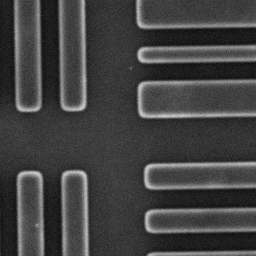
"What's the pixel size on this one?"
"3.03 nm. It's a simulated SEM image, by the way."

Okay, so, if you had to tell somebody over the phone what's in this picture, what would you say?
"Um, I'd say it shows groups of lines, slits or small figures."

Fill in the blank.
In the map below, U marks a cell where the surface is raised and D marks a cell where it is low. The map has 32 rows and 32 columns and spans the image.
DDUUUDDDUUUDDDDDDUUUUUUUUUUUUUUU
DDUUUDDDUUUDDDDDDUUUUUUUUUUUUUUU
DDUUUDDDUUUDDDDDDUUUUUUUUUUUUUUU
DDUUUDDDUUUDDDDDDDDDDDDDDDDDDDDD
DDUUUDDDUUUDDDDDDDDDDDDDDDDDDDDD
DDUUUDDDUUUDDDDDDDDDDDDDDDDDDDDD
DDUUUDDDUUUDDDDDDDUUUUUUUUUUUUUU
DDUUUDDDUUUDDDDDDDUUUUUUUUUUUUUU
DDUUUDDDUUUDDDDDDDDDDDDDDDDDDDDD
DDUUUDDDUUUDDDDDDDDDDDDDDDDDDDDD
DDUUUDDDUUUDDDDDDDUUUUUUUUUUUUUU
DDUUUDDDUUUDDDDDDUUUUUUUUUUUUUUU
DDUUUDDDUUUDDDDDDUUUUUUUUUUUUUUU
DDUUUDDDUUDDDDDDDUUUUUUUUUUUUUUU
DDDDDDDDDDDDDDDDDDUUUUUDDDDDDDDD
DDDDDDDDDDDDDDDDDDDDDDDDDDDDDDDD
DDDDDDDDDDDDDDDDDDDDDDDDDDDDDDDD
DDDDDDDDDDDDDDDDDDDDDDDDDDDDDDDD
DDDDDDDDDDDDDDDDDDDDDDDDDDDDDDDD
DDDDDDDDDDDDDDDDDDDDDDDDDDDDDDDD
DDDDDDDDDDDDDDDDDDDDDDDDDDUUUUUU
DDDDDDDDDDDDDDDDDDUUUUUUUUUUUUUU
DDUUUDDDUUUDDDDDDDUUUUUUUUUUUUUU
DDUUUDDDUUUDDDDDDDDUUUUUUUDDDDDD
DDUUUDDDUUUDDDDDDDDDDDDDDDDDDDDD
DDUUUDDDUUUDDDDDDDDDDDDDDDDDDDDD
DDUUUDDDUUUDDDDDDDDUUUUUUUUUUUUU
DDUUUDDDUUUDDDDDDDUUUUUUUUUUUUUU
DDUUUDDDUUUDDDDDDDUUUUUUUUUUUUUU
DDUUUDDDUUUDDDDDDDDDDDDDDDDDDDDD
DDUUUDDDUUUDDDDDDDDDDDDDDDDDDDDD
DDUUUDDDUUUDDDDDDDDDDDDDDDDUUUUU